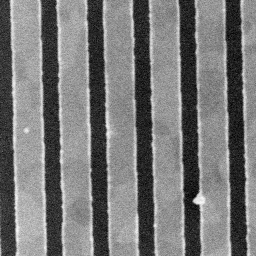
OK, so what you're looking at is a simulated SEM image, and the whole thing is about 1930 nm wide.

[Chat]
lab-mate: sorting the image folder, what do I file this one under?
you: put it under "lines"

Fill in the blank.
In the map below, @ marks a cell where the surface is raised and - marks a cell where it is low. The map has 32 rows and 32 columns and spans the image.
-@@@@--@@@@--@@@@--@@@--@@@@--@@
-@@@@--@@@@--@@@@--@@@---@@@--@@
-@@@@--@@@@--@@@@--@@@---@@@--@@
-@@@@--@@@@--@@@@--@@@---@@@--@@
-@@@@--@@@@--@@@@--@@@--@@@@--@@
-@@@@--@@@@--@@@@--@@@---@@@--@@
-@@@@--@@@@--@@@@--@@@---@@@--@@
--@@@--@@@@--@@@@--@@@---@@@--@@
--@@@--@@@@--@@@@--@@@---@@@--@@
--@@@--@@@@--@@@@--@@@---@@@--@@
--@@@--@@@@--@@@@--@@@---@@@---@
--@@@--@@@@--@@@@--@@@---@@@--@@
--@@@--@@@@--@@@@--@@@@--@@@---@
--@@@--@@@@--@@@@--@@@@--@@@---@
--@@@--@@@@--@@@@--@@@@--@@@---@
--@@@---@@@--@@@@--@@@@--@@@---@
--@@@---@@@--@@@@--@@@@--@@@---@
--@@@---@@@--@@@@--@@@@--@@@---@
--@@@---@@@--@@@@--@@@@--@@@@--@
--@@@---@@@--@@@@--@@@@--@@@@--@
--@@@---@@@--@@@@--@@@@--@@@@--@
--@@@---@@@---@@@--@@@@--@@@@--@
--@@@---@@@---@@@--@@@@--@@@@--@
--@@@---@@@---@@@--@@@@--@@@@--@
--@@@@--@@@---@@@--@@@@--@@@@--@
--@@@@--@@@---@@@--@@@@--@@@@--@
--@@@@--@@@---@@@--@@@@--@@@@--@
--@@@@--@@@---@@@--@@@@--@@@@--@
--@@@@--@@@---@@@--@@@@--@@@@--@
--@@@@--@@@@--@@@--@@@@--@@@@--@
--@@@@--@@@@--@@@--@@@@--@@@@--@
--@@@@--@@@@--@@@--@@@@--@@@@--@